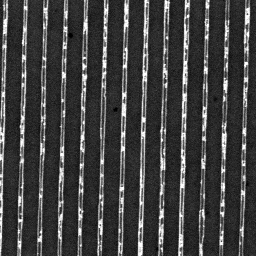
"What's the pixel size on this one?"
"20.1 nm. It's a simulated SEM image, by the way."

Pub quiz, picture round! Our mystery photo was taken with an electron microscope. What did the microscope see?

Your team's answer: parallel lines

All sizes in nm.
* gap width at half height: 334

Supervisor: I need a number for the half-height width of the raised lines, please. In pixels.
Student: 3.5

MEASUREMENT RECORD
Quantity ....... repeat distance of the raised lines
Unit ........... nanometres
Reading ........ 405